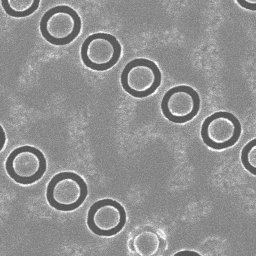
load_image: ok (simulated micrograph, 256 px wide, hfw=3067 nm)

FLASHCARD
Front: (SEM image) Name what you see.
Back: a regular array of ring-shaped grooves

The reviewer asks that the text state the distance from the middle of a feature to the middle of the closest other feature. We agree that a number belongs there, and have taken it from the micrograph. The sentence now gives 569 nm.